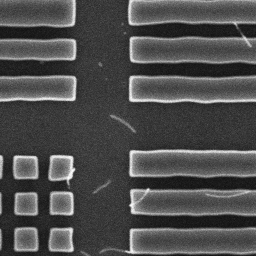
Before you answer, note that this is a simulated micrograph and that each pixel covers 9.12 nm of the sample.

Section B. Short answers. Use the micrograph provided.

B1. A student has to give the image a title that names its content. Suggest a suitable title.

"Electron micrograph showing groups of lines, slits or small figures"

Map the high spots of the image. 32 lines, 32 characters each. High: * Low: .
*********.......****************
*********.......****************
*********.......****************
................................
................................
*********.......****************
*********.......****************
.................***************
................................
................................
*********.......****************
*********.......****************
.................***************
................................
................................
................................
................................
................................
................................
................****************
..***.***.......****************
..***.***.......****************
................................
................................
..***.***.......****************
..***.***.......****************
..**..***........***************
................................
................................
..***.***.......****************
..***.***.......****************
.................***************